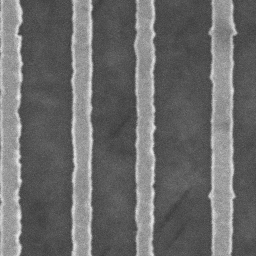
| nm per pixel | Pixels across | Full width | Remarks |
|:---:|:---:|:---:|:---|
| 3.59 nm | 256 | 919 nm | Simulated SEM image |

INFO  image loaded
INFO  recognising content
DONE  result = one or a few lines or trenches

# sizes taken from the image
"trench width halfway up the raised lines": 193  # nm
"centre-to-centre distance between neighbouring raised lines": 252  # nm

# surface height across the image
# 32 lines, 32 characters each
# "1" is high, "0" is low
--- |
11000000011000000110000000011000
11100000011000000110000000011000
11100000011000000110000000011000
11000000011000000110000000111000
11000000011000000110000000111000
11000000011000000110000000111000
11000000011000000110000000111000
11100000011000000110000000011000
11100000011000000110000000011000
11100000011000000110000000111000
11100000011000000110000000011000
11000000011000000110000000011000
11000000011000000110000000011000
11000000011000000110000000011000
11000000011000000110000000011000
11000000011000000110000000111000
11000000011000000110000000011000
11000000011000000110000000111000
11000000011000000110000000011000
11000000011000000110000000011000
11000000011000000110000000011000
11000000011000000110000000011000
11000000011000000110000000011000
11000000011000000110000000011000
11000000011000000110000000111000
11000000011000000110000000111000
11000000011000000110000000011000
11000000011000000110000000011000
11100000011000000110000000011000
11000000011000000110000000011000
11000000011000000110000000011000
11000000011000000110000000011000